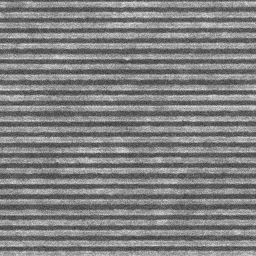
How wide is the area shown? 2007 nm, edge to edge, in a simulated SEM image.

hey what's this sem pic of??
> parallel lines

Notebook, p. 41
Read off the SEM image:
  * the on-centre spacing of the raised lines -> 81.4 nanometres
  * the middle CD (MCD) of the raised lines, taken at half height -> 4.62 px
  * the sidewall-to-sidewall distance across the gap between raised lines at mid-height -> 50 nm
